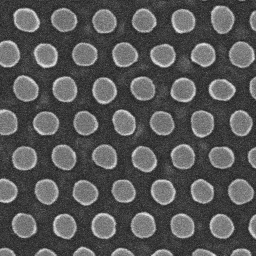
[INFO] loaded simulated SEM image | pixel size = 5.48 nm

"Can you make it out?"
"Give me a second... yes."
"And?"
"a regular array of raised bodies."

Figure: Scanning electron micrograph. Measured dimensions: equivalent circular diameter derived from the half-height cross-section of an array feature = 131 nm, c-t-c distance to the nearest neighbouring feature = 210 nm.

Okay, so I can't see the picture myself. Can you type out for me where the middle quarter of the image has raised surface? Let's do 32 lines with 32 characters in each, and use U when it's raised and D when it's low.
DDDDDDDDDDDDDDUUDDDDDDDDDUDDDDDD
DDDDDDDDDDDDDDDDDDDDDDDDDDDDDDDD
DDDDDDDDDDDDDDDDDDDDDDDDDDDDDDDD
UUDDDDDDDUDDDDDDDDUUUDDDDDDDDDDD
UUDDDDDDUUUUDDDDDUUUUUDDDDDDUUUU
UUUDDDDDUUUUUDDDDUUUUUDDDDDUUUUU
UUUDDDDUUUUUUDDDDUUUUUUDDDDUUUUU
UUUDDDDUUUUUUDDDDUUUUUUDDDDUUUUU
UUUDDDDDUUUUUDDDDDUUUUDDDDDDUUUU
DDDDDDDDDUUDDDDDDDDDDDDDDDDDDDDD
DDDDDDDDDDDDDDDDDDDDDDDDDDDDDDDD
DDDDDDDDDDDDDDDDDDDDDDDDDDDDDDDD
DDDUUUDDDDDDDUUUDDDDDDUUUUDDDDDD
DDDUUUUUDDDDUUUUUDDDDDUUUUUDDDDD
DDUUUUUUDDDDUUUUUUDDDUUUUUUDDDDD
DDDUUUUUDDDDDUUUUUDDDDUUUUUUDDDD
DDDUUUUUDDDDDUUUUUDDDDUUUUUDDDDD
DDDDUUDDDDDDDDUUUDDDDDDUUUDDDDDD
DDDDDDDDDDDDDDDDDDDDDDDDDDDDDDDD
DDDDDDDDDDDDDDDDDDDDDDDDDDDDDDDD
DDDDDDDDDUUDDDDDDDDDDDDDDDDDDUUD
UUDDDDDDUUUUUDDDDDUUUUDDDDDUUUUU
UUDDDDDUUUUUUDDDDUUUUUUDDDDUUUUU
UUUDDDDUUUUUUDDDDUUUUUUDDDDUUUUU
UUUDDDDDUUUUUDDDDUUUUUUDDDDUUUUU
UUDDDDDDDUUUDDDDDDUUUUUDDDDDUUUU
DDDDDDDDDDDDDDDDDDDUUUDDDDDDDDDD
DDDDDDDDDDDDDDDDDDDDDDDDDDDDDDDD
DDDDDDDDDDDDDDDDDDDDDDDDDDDDDDDD
DDDDUUDDDDDDDUUUDDDDDDDUUUDDDDDD
DDDUUUUDDDDDUUUUUDDDDDUUUUUDDDDD
DDUUUUUUDDDDUUUUUUDDDDUUUUUUDDDD